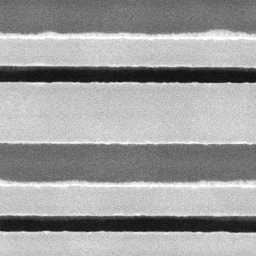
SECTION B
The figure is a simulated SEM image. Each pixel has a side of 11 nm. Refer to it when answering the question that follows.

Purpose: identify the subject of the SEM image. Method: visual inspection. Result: lines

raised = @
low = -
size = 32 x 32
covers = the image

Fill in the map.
--------------------------------
--------------------------------
--------------------------------
--------------------------------
------@-------------------@-----
@@@@@@@@@@@@@@@@@@@@@@@@@@@@@@@@
@@@@@@@@@@@@@@@@@@@@@@@@@@@@@@@@
@@@@@@@@@@@@@@@@@@@@@@@@@@@@@@@@
--------------------------------
--------------------------------
@@@@@@@@@@@@@@@@@@@@@@@@@@@@@@@@
@@@@@@@@@@@@@@@@@@@@@@@@@@@@@@@@
@@@@@@@@@@@@@@@@@@@@@@@@@@@@@@@@
@@@@@@@@@@@@@@@@@@@@@@@@@@@@@@@@
@@@@@@@@@@@@@@@@@@@@@@@@@@@@@@@@
@@@@@@@@@@@@@@@@@@@@@@@@@@@@@@@@
@@@@@@@@@@@@@@@@@@@@@@@@@@@@@@@@
@@@@@@@@@@@@@@@@@@@@@@@@@@@@@@@@
--------------------------------
--------------------------------
--------------------------------
--------------------------------
--------------------------------
@@@@@@@@@@@@@@@@@@@@@@@@@@@@@@@@
@@@@@@@@@@@@@@@@@@@@@@@@@@@@@@@@
@@@@@@@@@@@@@@@@@@@@@@@@@@@@@@@@
@@@@@@@@@@@@@@@@@@@@@@@@@@@@@@@@
--------------------------------
--------------------------------
@@@@@@@@@@@@@@@@@@@@@@@@@@@@@@@@
@@@@@@@@@@@@@@@@@@@@@@@@@@@@@@@@
@@@@@@@@@@@@@@@@@@@@@@@@@@@@@@@@